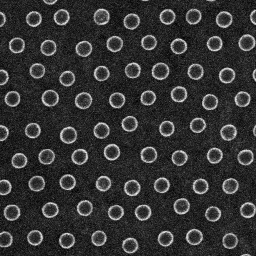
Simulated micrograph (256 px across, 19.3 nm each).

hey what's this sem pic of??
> a regular array of raised bodies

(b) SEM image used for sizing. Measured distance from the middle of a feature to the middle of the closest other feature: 28.2 pixels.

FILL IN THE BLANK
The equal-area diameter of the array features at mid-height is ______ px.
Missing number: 15.1